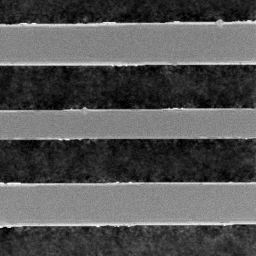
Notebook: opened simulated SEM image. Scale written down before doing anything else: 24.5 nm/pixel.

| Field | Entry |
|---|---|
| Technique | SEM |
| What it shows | lines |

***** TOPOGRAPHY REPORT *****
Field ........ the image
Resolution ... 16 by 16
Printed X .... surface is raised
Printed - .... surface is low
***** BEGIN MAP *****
----------------
-------XXXXXXXXX
XXXXXXXXXXXXXXXX
XXXXXXXXXXXXXXXX
----------------
----------------
----------------
XXXXXXXXXXXXXXXX
XXXXXXXXXXXXXXXX
----------------
----------------
--------XXXXXXXX
XXXXXXXXXXXXXXXX
XXXXXXXXXXXXXXXX
----------------
----------------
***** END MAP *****